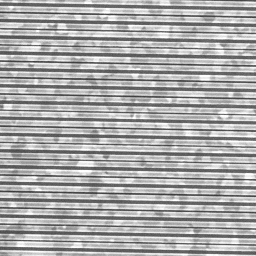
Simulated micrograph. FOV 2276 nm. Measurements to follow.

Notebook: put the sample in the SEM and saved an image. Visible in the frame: parallel lines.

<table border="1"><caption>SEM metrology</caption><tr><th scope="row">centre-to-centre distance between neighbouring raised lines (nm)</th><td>72.2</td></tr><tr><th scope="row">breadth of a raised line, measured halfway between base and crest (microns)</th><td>0.0411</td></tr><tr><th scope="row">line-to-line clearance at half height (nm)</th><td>40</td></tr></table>